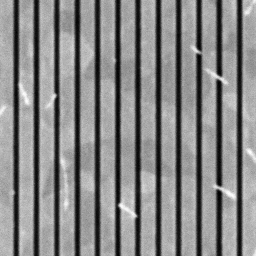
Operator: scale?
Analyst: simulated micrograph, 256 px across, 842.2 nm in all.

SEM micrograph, parallel lines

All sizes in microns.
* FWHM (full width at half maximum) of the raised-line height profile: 0.0456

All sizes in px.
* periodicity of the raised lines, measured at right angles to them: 20.2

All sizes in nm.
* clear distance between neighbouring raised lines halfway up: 22.6